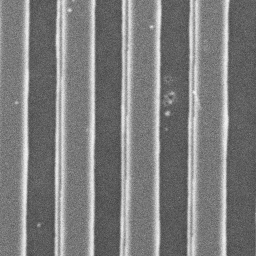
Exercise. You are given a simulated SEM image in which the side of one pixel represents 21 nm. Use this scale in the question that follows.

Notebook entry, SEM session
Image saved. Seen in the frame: lines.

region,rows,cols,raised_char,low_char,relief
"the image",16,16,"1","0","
1100110011001100
1100110011001100
1100110011001100
1100110011001100
1100110011001100
1100110011001100
1100110011001100
1100110011001100
1100110011001100
1100110011001100
1100110011001100
1100110011001100
1100110011001100
1100110011001100
1100110011001100
1100110011001100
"